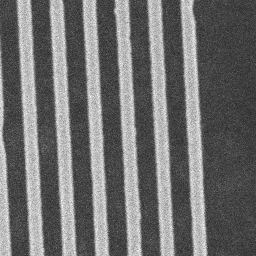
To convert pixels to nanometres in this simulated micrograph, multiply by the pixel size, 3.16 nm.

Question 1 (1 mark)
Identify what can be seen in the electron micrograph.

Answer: parallel lines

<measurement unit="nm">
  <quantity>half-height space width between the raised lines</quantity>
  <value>64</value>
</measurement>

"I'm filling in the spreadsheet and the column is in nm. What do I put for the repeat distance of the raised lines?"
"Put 103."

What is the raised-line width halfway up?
38.3 nm